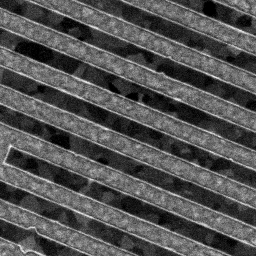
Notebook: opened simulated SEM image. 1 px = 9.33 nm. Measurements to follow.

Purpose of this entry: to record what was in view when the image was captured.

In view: parallel lines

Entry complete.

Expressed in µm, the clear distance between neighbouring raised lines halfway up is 0.157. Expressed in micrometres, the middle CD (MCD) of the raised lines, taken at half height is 0.172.